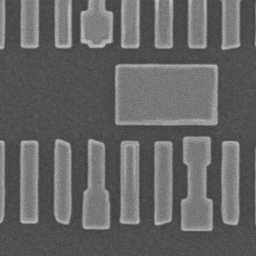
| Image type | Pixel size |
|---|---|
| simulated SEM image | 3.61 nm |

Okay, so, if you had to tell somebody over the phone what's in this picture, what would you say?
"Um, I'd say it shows wiring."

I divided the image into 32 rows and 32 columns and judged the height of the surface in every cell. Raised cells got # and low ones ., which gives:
#..##..##..##..##..###..##..##..
#..##..##.####.##..###..##..##..
#..##..##.####.##..##...##..##..
#..##..##.####.##..##...##..##..
...##..##.####.##..##...##..##..
...##..##..##..##..##...##..##..
................................
................................
..............#############.....
..............#############.....
..............#############.....
..............#############.....
..............#############.....
..............#############.....
..............#############.....
...............############.....
................................
.......................###......
...##..##..##..##..##..###..##..
...##..##..##..##..##..###..##..
...##..##..##..##..##..###..##..
...##..##..##..##..##...##..##..
...##..##..##..##..##...##..##..
...##..##..##..##..##...##..##..
...##..##..###.##..##..###..##..
...##..##.####.##..##..####.##..
...##..##.####.##..##..####.##..
...##..##.####.##..##..####.##..
...........##..........###......
................................
................................
................................